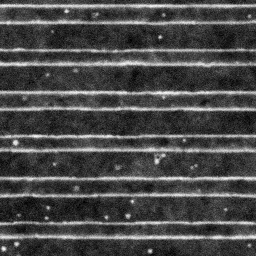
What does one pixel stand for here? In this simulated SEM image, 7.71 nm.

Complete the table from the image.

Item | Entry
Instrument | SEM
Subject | lines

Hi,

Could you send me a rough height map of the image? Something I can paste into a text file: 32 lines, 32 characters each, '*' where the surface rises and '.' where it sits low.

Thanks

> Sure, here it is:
................................
********************************
********************************
................................
................................
................................
********************************
********************************
................................
................................
................................
................................
********************************
********************************
................................
................................
................................
********************************
********************************
................................
................................
................................
********************************
********************************
*...**.*****..................**
................................
................................
................................
********************************
********************************
................................
................................